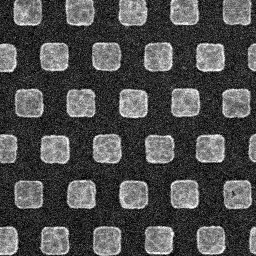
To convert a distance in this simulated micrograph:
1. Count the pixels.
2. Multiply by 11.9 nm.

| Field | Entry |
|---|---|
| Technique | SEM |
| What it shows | a regular array of raised bodies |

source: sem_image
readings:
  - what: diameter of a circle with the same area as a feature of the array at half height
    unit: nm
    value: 347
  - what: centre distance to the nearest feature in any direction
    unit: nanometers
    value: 616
